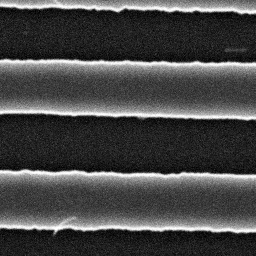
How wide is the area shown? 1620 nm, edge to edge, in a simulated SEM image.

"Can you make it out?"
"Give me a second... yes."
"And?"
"lines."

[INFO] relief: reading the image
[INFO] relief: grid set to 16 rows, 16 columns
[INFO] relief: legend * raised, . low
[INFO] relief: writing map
....************
................
................
................
****************
****************
****************
................
................
................
................
****************
****************
****************
................
................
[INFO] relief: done